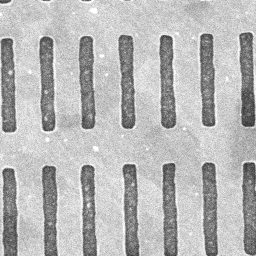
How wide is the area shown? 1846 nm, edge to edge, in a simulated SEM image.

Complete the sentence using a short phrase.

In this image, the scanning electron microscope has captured holes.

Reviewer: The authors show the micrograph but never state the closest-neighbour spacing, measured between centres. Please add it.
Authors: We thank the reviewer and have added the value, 288 nm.